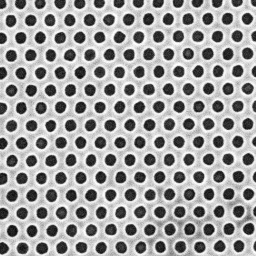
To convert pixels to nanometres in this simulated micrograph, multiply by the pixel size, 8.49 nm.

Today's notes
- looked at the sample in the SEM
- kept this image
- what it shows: a regular array of holes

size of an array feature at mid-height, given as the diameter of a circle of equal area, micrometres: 0.106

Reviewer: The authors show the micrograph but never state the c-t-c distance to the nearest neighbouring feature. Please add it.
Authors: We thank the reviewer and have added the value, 166 nanometres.